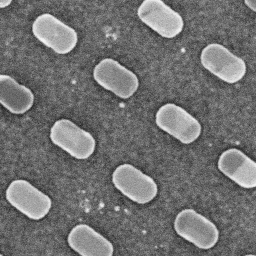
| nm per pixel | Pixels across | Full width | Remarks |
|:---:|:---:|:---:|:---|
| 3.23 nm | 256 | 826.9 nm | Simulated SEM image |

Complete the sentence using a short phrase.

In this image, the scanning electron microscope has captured a regular array of raised bodies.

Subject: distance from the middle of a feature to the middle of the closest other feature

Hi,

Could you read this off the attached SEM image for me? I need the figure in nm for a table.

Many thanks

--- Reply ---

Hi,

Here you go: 241